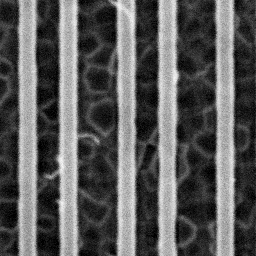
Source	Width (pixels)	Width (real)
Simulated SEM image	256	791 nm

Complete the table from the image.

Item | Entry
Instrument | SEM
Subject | parallel lines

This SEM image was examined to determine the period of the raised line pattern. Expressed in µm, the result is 0.153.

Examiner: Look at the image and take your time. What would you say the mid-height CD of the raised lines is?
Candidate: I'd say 46.7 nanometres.